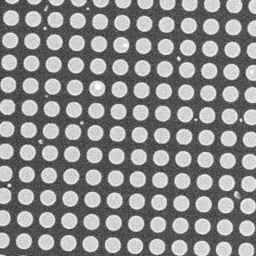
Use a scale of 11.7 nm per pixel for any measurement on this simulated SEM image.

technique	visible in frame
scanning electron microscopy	an array of small figures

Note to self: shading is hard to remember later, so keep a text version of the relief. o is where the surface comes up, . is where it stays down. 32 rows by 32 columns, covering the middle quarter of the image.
.oooo..ooo..oooo..ooo..oooo..ooo
.ooo...ooo..oooo..ooo..oooo..ooo
.............oo....oo...ooo..ooo
................................
..oo....o.......................
.oooo..ooo..ooo...ooo...oo....o.
.oooo.oooo..oooo..ooo..oooo..ooo
..oo...ooo..ooo...ooo..oooo..ooo
........................oo...ooo
................................
.ooo...oo...ooo...oo............
.ooo..oooo..ooo..oooo..ooo...ooo
.ooo..oooo..ooo..oooo..ooo...ooo
.............oo...oo...ooo...ooo
................................
.oo.............................
oooo..oooo..ooo...oo...ooo...oo.
oooo..oooo..ooo..oooo..ooo..oooo
.oo....oo...ooo..oooo..ooo..oooo
........................oo...oo.
................................
.ooo..ooo...oo..................
oooo..ooo..oooo..ooo...ooo..ooo.
oooo..ooo..oooo..ooo..oooo..oooo
.......o....oo...ooo...ooo..ooo.
.............................o..
.oo.............................
oooo..ooo..ooo...ooo...oo.......
oooo..ooo..oooo..ooo..oooo..ooo.
.oo...ooo..oooo..ooo..oooo..ooo.
..................o....oo...ooo.
................................